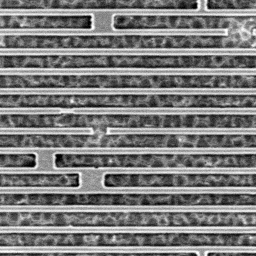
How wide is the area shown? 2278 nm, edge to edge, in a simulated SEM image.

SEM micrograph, parallel lines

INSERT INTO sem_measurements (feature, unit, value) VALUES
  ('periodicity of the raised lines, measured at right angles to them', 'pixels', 19.8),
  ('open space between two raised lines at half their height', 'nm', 124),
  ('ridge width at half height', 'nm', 53.4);